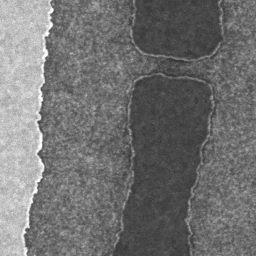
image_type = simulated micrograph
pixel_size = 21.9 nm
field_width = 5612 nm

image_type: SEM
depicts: one or a few lines or trenches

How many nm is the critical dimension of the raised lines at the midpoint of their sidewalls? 1660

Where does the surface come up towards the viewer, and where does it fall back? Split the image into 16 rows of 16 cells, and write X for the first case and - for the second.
XXX-----XXXXXX--
XXX-----XXXXXX--
XXX-----XXXXXX--
XXX-------XXX---
XXX-------------
XXX-----XXXXX---
XXX-----XXXXX---
XX------XXXXX---
XXX-----XXXXX---
XX------XXXXX---
XXX-----XXXX----
XX------XXXX----
XX------XXXX----
XX------XXXX----
XX-----XXXXX----
XX-----XXXXX----